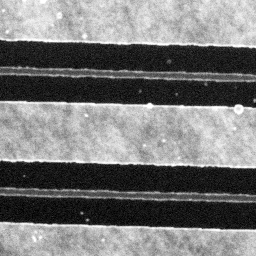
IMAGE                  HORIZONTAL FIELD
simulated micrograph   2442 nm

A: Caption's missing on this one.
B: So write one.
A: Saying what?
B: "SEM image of lines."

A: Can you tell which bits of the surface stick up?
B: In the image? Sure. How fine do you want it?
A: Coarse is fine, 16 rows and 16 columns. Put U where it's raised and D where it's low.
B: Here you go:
UUUUUUUUUUUUUUUU
UUUUUUUUUUUUUUUU
UUUUUUUUUUUUUUUU
DDDDDDDDDDDDDDDD
DDDDDDDDDDDDDDDD
DDDDDDDDDDDDDDDD
UUUUUUDDDDDDDDDD
UUUUUUUUUUUUUUUU
UUUUUUUUUUUUUUUU
UUUUUUUUUUUUUUUU
DDDDDDDDDDDDDDDD
DDDDDDDDDDDDDDDD
DDDDDDDDDDDDDDDD
DDDDDDDDDDDDDDDD
UUUUUUUUUUUUUUUU
UUUUUUUUUUUUUUUU